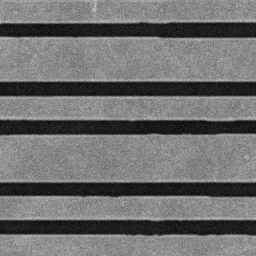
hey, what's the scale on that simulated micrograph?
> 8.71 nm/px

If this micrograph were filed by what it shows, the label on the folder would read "lines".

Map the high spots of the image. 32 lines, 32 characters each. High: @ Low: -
@@@@@@@@@@@@@@@@@@@@@@@@@@@@@@@@
@@@@@@@@@@@@@@@@@@@@@@@@@@@@@@@@
@@@@@@@@@@@@@@@@@@@@@@@@@@@@@@@@
--------------------------------
--------------------------------
@@@@@@@@@@@@@@@@@@@@@@@@@@@@@@@@
@@@@@@@@@@@@@@@@@@@@@@@@@@@@@@@@
@@@@@@@@@@@@@@@@@@@@@@@@@@@@@@@@
@@@@@@@@@@@@@@@@@@@@@@@@@@@@@@@@
@@@@@@@@@@@@@@@@@@@@@@@@@@@@@@@@
--------------------------------
--------------------------------
@@@@@@@@@@@@@@@@@@@@@@@@@@@@@@@@
@@@@@@@@@@@@@@@@@@@@@@@@@@@@@@@@
@@@@@@@@@@@@@@@@@@@@@@@@@@@@@@@@
--------------------------------
--------------------------------
@@@@@@@@@@@@@@@@@@@@@@@@@@@@@@@@
@@@@@@@@@@@@@@@@@@@@@@@@@@@@@@@@
@@@@@@@@@@@@@@@@@@@@@@@@@@@@@@@@
@@@@@@@@@@@@@@@@@@@@@@@@@@@@@@@@
@@@@@@@@@@@@@@@@@@@@@@@@@@@@@@@@
@@@@@@@@@@@@@@@@@@@@@@@@@@@@@@@@
--------------------------------
--------------------------------
@@@@@@@@@@@@@@@@@@@@@@@@@@@@@@@@
@@@@@@@@@@@@@@@@@@@@@@@@@@@@@@@@
--------------------------------
--------------------------------
@@@@@@@@@@@@@@@@-@--@@@@@--@@@@-
@@@@@@@@@@@@@@@@@@@@@@@@@@@@@@@@
@@@@@@@@@@@@@@@@@@@@@@@@@@@@@@@@